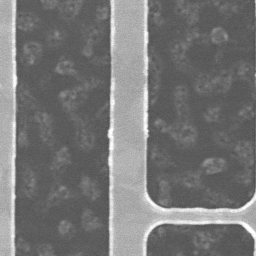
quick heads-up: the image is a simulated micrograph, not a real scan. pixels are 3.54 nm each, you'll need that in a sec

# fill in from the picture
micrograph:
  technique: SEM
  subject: one or a few lines or trenches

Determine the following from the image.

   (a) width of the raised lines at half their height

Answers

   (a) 0.13 micrometres